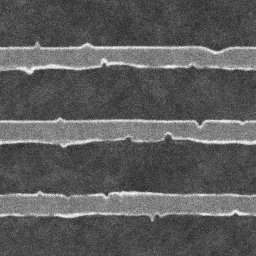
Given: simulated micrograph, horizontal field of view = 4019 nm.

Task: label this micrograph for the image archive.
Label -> one or a few lines or trenches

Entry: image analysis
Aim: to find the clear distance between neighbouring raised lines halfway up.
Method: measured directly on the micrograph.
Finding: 834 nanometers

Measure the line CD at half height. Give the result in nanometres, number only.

318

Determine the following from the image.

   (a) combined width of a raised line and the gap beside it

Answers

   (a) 73.6 px